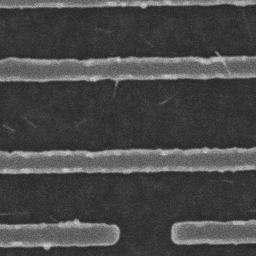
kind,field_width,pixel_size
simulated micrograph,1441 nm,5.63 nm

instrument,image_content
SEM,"one or a few lines or trenches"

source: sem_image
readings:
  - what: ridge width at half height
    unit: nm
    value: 122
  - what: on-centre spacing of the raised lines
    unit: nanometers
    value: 476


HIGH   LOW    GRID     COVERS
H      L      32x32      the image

HHHHHHHHHHHHHHHHHHHHHHHHHHHHLHHH
LLLLLLLLLLLLLLLLLLLLLLLLLLLLLLLL
LLLLLLLLLLLLLLLLLLLLLLLLLLLLLLLL
LLLLLLLLLLLLLLLLLLLLLLLLLLLLLLLL
LLLLLLLLLLLLLLLLLLLLLLLLLLLLLLLL
LLLLLLLLLLLLLLLLLLLLLLLLLLLLLLLL
LLLLLLLLLLLLLLLLLLLLLLLLLLLLLLLL
HHHHHHLLHLLLLHHHHHHHHHHHHHHHHHHH
HHHHHHHHHHHHHHHHHHHHHHHHHHHHHHHH
HHHHHHHHHHHHHHHHHHHHHHHHHHHHHHHH
LLLLLLLLLLLLLLLLLLLLLLLLLLLLLLLL
LLLLLLLLLLLLLLLLLLLLLLLLLLLLLLLL
LLLLLLLLLLLLLLLLLLLLLLLLLLLLLLLL
LLLLLLLLLLLLLLLLLLLLLLLLLLLLLLLL
LLLLLLLLLLLLLLLLLLLLLLLLLLLLLLLL
LLLLLLLLLLLLLLLLLLLLLLLLLLLLLLLL
LLLLLLLLLLLLLLLLLLLLLLLLLLLLLLLL
LLLLLLLLLLLLLLLLLLLLLLLLLLLLLLLL
LLLLLLLLLLLLLLLLLLLLLLLLLLLLLLLH
HHHHHHHHHHHHHHHHHHHHHHHHHHHHHHHH
HHHHHHHHHHHHHHHHHHHHHHHHHHHHHHHH
HHHHHHHHHHHHLLLHLLHLLLLLLLLLLLLL
LLLLLLLLLLLLLLLLLLLLLLLLLLLLLLLL
LLLLLLLLLLLLLLLLLLLLLLLLLLLLLLLL
LLLLLLLLLLLLLLLLLLLLLLLLLLLLLLLL
LLLLLLLLLLLLLLLLLLLLLLLLLLLLLLLL
LLLLLLLLLLLLLLLLLLLLLLLLLLLLLLLL
LLLLLLLLLHLLLLLLLLLLLLLLLLLLLLLL
HHHHHHHHHHHHHHHLLLLLLLHHHHHHHHHH
HHHHHHHHHHHHHHHLLLLLLLHHHHHHHHHH
HHHHHHHHHHHHHHLLLLLLLLLHLLLLLLLL
LLLLLLLLLLLLLLLLLLLLLLLLLLLLLLLL